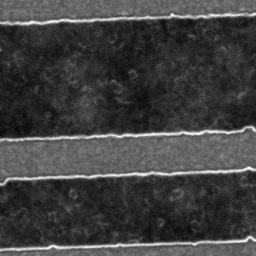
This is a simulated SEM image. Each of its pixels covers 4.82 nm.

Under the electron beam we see one or a few lines or trenches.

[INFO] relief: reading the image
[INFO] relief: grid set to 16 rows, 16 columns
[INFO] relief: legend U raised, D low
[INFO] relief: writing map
DDDDDDDDDDDDDDDD
UUUUUUUUUUUUUUUU
UUUUUUUUUUUUUUUU
UUUUUUUUUUUUUUUU
UUUUUUUUUUUUUUUU
UUUUUUUUUUUUUUUU
UUUUUUUUUUUUUUUU
UUUUUUUUUUUUUUUU
UUUUUUUUDDDDDDDD
DDDDDDDDDDDDDDDD
DDDDDDDDDDDDDDDD
UUUUUUUUUUUUUUUU
UUUUUUUUUUUUUUUU
UUUUUUUUUUUUUUUU
UUUUUUUUUUUUUUUU
UUUDDDDDDDDDDDDD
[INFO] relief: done